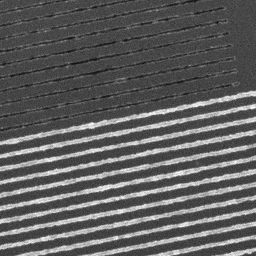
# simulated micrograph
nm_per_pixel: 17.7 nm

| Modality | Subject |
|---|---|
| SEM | parallel lines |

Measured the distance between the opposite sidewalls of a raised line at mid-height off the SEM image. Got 52.1 nanometers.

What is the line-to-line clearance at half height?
172 nm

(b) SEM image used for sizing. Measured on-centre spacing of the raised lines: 227 nm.